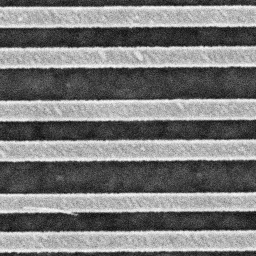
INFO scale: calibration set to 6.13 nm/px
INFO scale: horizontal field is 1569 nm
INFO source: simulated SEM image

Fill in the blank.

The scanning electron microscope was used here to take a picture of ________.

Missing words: lines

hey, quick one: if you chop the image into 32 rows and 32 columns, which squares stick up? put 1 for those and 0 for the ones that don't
00000000000000000000000000000000
11111111111111111111111111111111
11111111111111111111111111111111
00000000000000000000000000000000
00000000000000000000000000000000
00000000000000000000000000000000
11111111111111111111111111111111
11111111111111111111111111111111
00000000000000000000000000000000
00000000000000000000000000000000
00000000000000000000000000000000
00000000000000000000000000000000
00000000000000000000001111111111
11111111111111111111111111111111
11111111111111111111111111111111
00000000000000000000000000000000
00000000000000000000000000000000
00000000000000000000000000000000
11111111111111111111111111111111
11111111111111111111111111111111
00000000000000000000000000000000
00000000000000000000000000000000
00000000000000000000000000000000
00000000000000000000000000000000
11111111111111111111111111111111
11111111111111111111111111111111
11011000100000000000000000000000
00000000000000000000000000000000
00000000000000000000000000000000
11111111111111111111111111111111
11111111111111111111111111111111
11110000000000000000000000000000